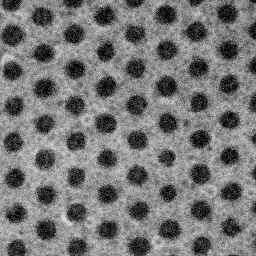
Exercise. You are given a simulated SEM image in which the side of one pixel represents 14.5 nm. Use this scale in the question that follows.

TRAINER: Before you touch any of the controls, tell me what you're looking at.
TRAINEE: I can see a regular array of raised bodies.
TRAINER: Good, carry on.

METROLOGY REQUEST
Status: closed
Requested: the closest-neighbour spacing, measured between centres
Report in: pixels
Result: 35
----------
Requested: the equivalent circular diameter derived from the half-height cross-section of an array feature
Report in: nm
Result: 299